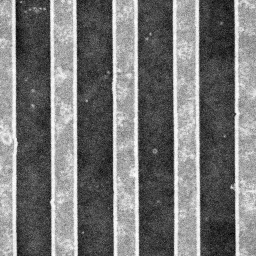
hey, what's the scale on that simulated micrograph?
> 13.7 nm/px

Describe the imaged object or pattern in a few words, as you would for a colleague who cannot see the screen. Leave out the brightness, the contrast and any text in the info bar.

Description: one or a few lines or trenches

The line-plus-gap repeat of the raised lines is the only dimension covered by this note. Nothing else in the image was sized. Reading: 838 nm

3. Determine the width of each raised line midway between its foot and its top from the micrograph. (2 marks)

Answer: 310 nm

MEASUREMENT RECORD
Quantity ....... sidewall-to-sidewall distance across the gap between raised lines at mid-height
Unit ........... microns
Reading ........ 0.535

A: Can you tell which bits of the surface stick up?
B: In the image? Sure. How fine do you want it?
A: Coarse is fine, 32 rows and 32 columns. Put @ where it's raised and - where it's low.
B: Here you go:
@@-----@@-----@@@-----@@@-----@@
@@-----@@-----@@@-----@@@-----@@
@@-----@@-----@@@-----@@@-----@@
@@-----@@-----@@@-----@@@-----@@
@@-----@@-----@@@-----@@@-----@@
@@-----@@-----@@@-----@@@-----@@
@@-----@@-----@@@-----@@@-----@@
@@-----@@-----@@@-----@@@-----@@
@@-----@@-----@@@-----@@@-----@@
@@-----@@-----@@@-----@@@-----@@
@@-----@@-----@@@-----@@@-----@@
@@-----@@-----@@@-----@@@-----@@
@@-----@@-----@@@-----@@@-----@@
@@-----@@-----@@@-----@@@-----@@
@@-----@@-----@@@-----@@@-----@@
@@-----@@-----@@@-----@@@-----@@
@@-----@@-----@@@-----@@@-----@@
@@-----@@-----@@@-----@@@-----@@
@@-----@@-----@@@-----@@@-----@@
@@-----@@-----@@@-----@@@-----@@
@@-----@@-----@@@-----@@@-----@@
@@-----@@-----@@@-----@@@-----@@
@@-----@@-----@@@-----@@@-----@@
@@-----@@-----@@@-----@@@-----@@
@@-----@@-----@@@-----@@@-----@@
@@-----@@-----@@@-----@@@-----@@
@@-----@@-----@@@-----@@@-----@@
@@-----@@-----@@@-----@@@-----@@
@@-----@@-----@@@-----@@@-----@@
@@-----@@-----@@@-----@@@-----@@
@@-----@@-----@@@-----@@@-----@@
@@-----@@-----@@@-----@@@-----@@